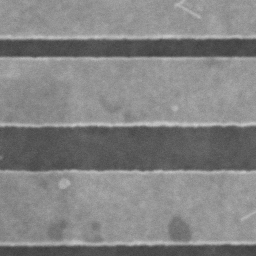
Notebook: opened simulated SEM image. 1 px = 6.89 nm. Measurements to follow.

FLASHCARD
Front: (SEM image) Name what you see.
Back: lines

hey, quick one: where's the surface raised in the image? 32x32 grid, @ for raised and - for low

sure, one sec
@@@@@@@@@@@@@@@@@@@@@@@@@@@@@@@@
@@@@@@@@@@@@@@@@@@@@@@@@@@@@@@@@
@@@@@@@@@@@@@@@@@@@@@@@@@@@@@@@@
@@@@@@@@@@@@@@@@@@@@@@@@@@@@@@@@
@@@@@@@@@@@@@@@@@@@@@@@@@@@@@@@@
--------------------------------
--------------------------------
@@@@@@@@@@@@@@@@@@@@@@@@@@@@@@@@
@@@@@@@@@@@@@@@@@@@@@@@@@@@@@@@@
@@@@@@@@@@@@@@@@@@@@@@@@@@@@@@@@
@@@@@@@@@@@@@@@@@@@@@@@@@@@@@@@@
@@@@@@@@@@@@@@@@@@@@@@@@@@@@@@@@
@@@@@@@@@@@@@@@@@@@@@@@@@@@@@@@@
@@@@@@@@@@@@@@@@@@@@@@@@@@@@@@@@
@@@@@@@@@@@@@@@@@@@@@@@@@@@@@@@@
@@@@@@@@@@@@@@@@@@@@@@@@@@@@@@@@
--------------------------------
--------------------------------
--------------------------------
--------------------------------
--------------------------------
@@@@--@@@@@@@@@@@@@@@@@@@@@@@@@@
@@@@@@@@@@@@@@@@@@@@@@@@@@@@@@@@
@@@@@@@@@@@@@@@@@@@@@@@@@@@@@@@@
@@@@@@@@@@@@@@@@@@@@@@@@@@@@@@@@
@@@@@@@@@@@@@@@@@@@@@@@@@@@@@@@@
@@@@@@@@@@@@@@@@@@@@@@@@@@@@@@@@
@@@@@@@@@@@@@@@@@@@@@@@@@@@@@@@@
@@@@@@@@@@@@@@@@@@@@@@@@@@@@@@@@
@@@@@@@@@@@@@@@@@@@@@@@@@@@@@@@@
@@@@@@@@@@@@@@@@@@@@@@@@@----@-@
--------------------------------